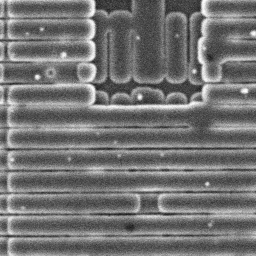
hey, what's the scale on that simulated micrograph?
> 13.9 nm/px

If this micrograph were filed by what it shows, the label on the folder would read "wiring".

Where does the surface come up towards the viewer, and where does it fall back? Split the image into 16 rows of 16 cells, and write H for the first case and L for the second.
HHHHHHLLLLLLLHHH
HHHHHHLLLLLLLHHH
HHHHHHLLLLLLLHHH
HHHHHHLLLLLLHHHH
HHHHHHLLLLLLLHHH
HHHHHHLLLLLLLHHH
HHHHHHLLLLLLHHHH
HHHHHHHHHHHHHHHH
HHHHHHHHHHHHHHHH
HHHHHHHHHHHHHHHH
HHHHHHHHHHHHHHHH
HHHHHHHHHHHHHHHH
HHHHHHHHHHHHHHHH
HHHHHHHHHHHHHHHH
HHHHHHHHHHHHHHHH
HHHHHHHHHHHHHHHH